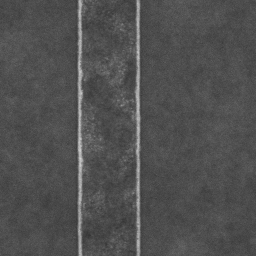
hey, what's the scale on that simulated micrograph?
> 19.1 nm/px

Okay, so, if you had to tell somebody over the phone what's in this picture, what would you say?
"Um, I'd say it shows one or a few lines or trenches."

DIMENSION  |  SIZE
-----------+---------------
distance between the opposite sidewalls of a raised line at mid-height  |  1110 nanometres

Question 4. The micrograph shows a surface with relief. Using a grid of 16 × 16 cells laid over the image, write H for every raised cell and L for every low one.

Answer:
LLLLLHHHHLLLLLLL
LLLLLHHHHLLLLLLL
LLLLLHHHHLLLLLLL
LLLLLHHHHLLLLLLL
LLLLLHHHHLLLLLLL
LLLLLHHHHLLLLLLL
LLLLLHHHHLLLLLLL
LLLLLHHHHLLLLLLL
LLLLLHHHHLLLLLLL
LLLLLHHHHLLLLLLL
LLLLLHHHHLLLLLLL
LLLLLHHHHLLLLLLL
LLLLLHHHHLLLLLLL
LLLLLHHHHLLLLLLL
LLLLLHHHHLLLLLLL
LLLLLHHHHLLLLLLL